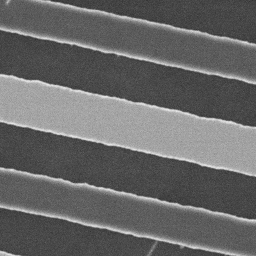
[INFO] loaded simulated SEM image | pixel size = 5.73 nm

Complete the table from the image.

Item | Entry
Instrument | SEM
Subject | lines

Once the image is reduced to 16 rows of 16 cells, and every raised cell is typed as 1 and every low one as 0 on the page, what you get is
1111100000000000
1111111111000000
0001111111111110
0000000011111111
0000000000001111
1111000000000000
1111111110000000
1111111111111100
0000111111111111
0000000001111111
0000000000000111
1111100000000000
1111111111000000
0001111111111110
0000000111111111
0000000000001111